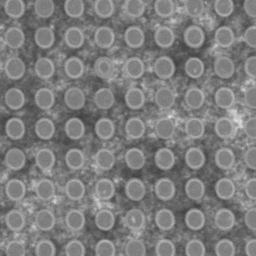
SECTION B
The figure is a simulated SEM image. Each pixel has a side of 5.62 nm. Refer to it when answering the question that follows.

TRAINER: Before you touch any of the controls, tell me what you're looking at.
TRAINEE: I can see a regular array of raised bodies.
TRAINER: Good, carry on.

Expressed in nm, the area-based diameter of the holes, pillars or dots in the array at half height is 112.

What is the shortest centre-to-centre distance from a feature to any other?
29.6 px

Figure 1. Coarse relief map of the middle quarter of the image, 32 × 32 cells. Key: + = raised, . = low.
+++++...++++...+++++...+++++..++
+++++...++++...+++++...+++++..++
.+++....++++....++++...++++....+
................................
................................
................................
.+++.....++.....+++.....++.....+
.++++...++++....++++...++++...++
+++++...++++...+++++...+++++..++
.++++...++++....++++...++++....+
.+++.....+++....+++.....+++....+
................................
................................
................................
.+++....++++....++++...++++....+
+++++...++++...+++++...+++++...+
+++++...++++...+++++...++++....+
.++++...++++....++++...++++....+
..++......+.....................
................................
................................
..++.....++.....+++.....++.....+
.+++....++++....++++...++++....+
+++++...++++....++++...++++....+
.++++...++++....++++...++++....+
.+++.....+++....++++....+++....+
................................
................................
................................
.+++.....+++....+++....++++....+
+++++...++++....++++...++++....+
+++++...++++....++++...++++....+